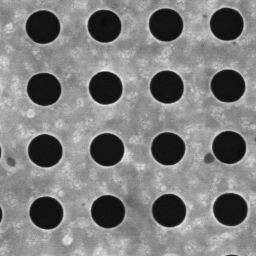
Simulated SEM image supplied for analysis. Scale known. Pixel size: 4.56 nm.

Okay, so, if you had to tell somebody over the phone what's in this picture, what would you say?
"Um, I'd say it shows a regular array of holes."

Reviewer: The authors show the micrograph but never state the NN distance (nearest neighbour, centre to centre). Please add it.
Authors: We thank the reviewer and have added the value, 0.279 µm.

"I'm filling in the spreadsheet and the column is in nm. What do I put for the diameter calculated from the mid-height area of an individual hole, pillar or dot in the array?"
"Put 151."